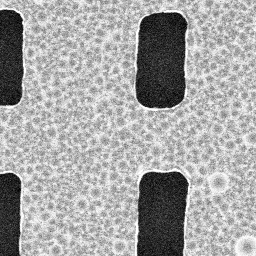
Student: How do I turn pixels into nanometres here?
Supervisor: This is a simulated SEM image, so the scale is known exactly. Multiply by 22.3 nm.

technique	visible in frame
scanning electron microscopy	holes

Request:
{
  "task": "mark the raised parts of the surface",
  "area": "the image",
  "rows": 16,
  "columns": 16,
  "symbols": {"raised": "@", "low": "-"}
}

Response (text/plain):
@@@@@@@@@@@@@@@@
-@@@@@@@@---@@@@
-@@@@@@@@---@@@@
-@@@@@@@@---@@@@
-@@@@@@@----@@@@
-@@@@@@@----@@@@
-@@@@@@@@--@@@@@
@@@@@@@@@@@@@@@@
@@@@@@@@@@@@@@@@
@@@@@@@@@@@@@@@@
@@@@@@@@@@@@@@@@
-@@@@@@@@---@@@@
-@@@@@@@@---@@@@
-@@@@@@@@---@@@@
-@@@@@@@@---@@@@
-@@@@@@@@---@@@@